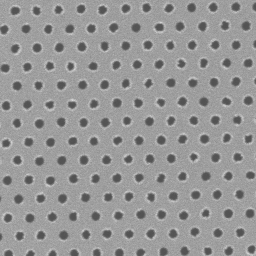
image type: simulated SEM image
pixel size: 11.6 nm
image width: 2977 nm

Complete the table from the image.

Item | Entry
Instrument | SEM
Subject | a regular array of holes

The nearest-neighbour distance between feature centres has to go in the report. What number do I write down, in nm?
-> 245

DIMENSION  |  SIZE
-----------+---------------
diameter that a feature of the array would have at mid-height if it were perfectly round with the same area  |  99.1 nm